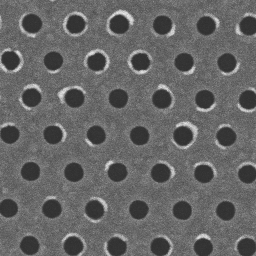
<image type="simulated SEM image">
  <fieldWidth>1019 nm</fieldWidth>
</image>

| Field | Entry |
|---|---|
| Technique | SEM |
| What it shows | a regular array of holes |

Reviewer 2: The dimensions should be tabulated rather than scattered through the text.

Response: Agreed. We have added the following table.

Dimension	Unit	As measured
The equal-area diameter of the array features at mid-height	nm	76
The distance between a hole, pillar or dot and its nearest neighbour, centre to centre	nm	170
